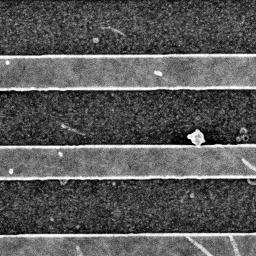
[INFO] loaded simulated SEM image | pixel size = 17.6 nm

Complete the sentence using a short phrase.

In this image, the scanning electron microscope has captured lines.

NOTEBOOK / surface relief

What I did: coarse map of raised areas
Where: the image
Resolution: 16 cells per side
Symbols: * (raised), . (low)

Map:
................
................
................
..**************
****************
****************
................
................
............*...
****************
****************
................
................
................
................
****************